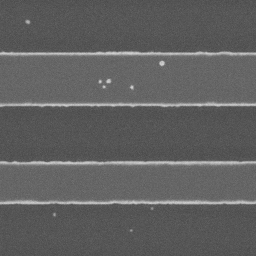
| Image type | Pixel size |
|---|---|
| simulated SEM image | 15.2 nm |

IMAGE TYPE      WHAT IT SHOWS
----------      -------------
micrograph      lines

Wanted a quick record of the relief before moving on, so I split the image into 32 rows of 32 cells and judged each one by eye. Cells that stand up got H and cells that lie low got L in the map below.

LLLLLLLLLLLLLLLLLLLLLLLLLLLLLLLL
LLLLLLLLLLLLLLLLLLLLLLLLLLLLLLLL
LLLLLLLLLLLLLLLLLLLLLLLLLLLLLLLL
LLLLLLLLLLLLLLLLLLLLLLLLLLLLLLLL
LLLLLLLLLLLLLLLLLLLLLLLLLLLLLLLL
LLLLLLLLLLLLLLLLLLLLLLLLLLLLLLLL
LLLLLLLLLLLLLLLLLLLLLLLLLLLLLLLL
HHHHHHHHHHHHHHHHHHHHHHHHHHHHHHHH
HHHHHHHHHHHHHHHHHHHHHHHHHHHHHHHH
HHHHHHHHHHHHHHHHHHHHHHHHHHHHHHHH
HHHHHHHHHHHHHHHHHHHHHHHHHHHHHHHH
HHHHHHHHHHHHHHHHHHHHHHHHHHHHHHHH
HHHHHHHHHHHHHHHHHHHHHHHHHHHHHHHH
LLLLLLLLLLLLLLLLLLLLLLLLLLLLLLLL
LLLLLLLLLLLLLLLLLLLLLLLLLLLLLLLL
LLLLLLLLLLLLLLLLLLLLLLLLLLLLLLLL
LLLLLLLLLLLLLLLLLLLLLLLLLLLLLLLL
LLLLLLLLLLLLLLLLLLLLLLLLLLLLLLLL
LLLLLLLLLLLLLLLLLLLLLLLLLLLLLLLL
LLLLLLLLLLLLLLLLLLLLLLLLLLLLLLLL
HHHHHHHHHHHHHHHHHHHHHHHHHHHHHHHH
HHHHHHHHHHHHHHHHHHHHHHHHHHHHHHHH
HHHHHHHHHHHHHHHHHHHHHHHHHHHHHHHH
HHHHHHHHHHHHHHHHHHHHHHHHHHHHHHHH
HHHHHHHHHHHHHHHHHHHHHHHHHHHHHHHH
LLLLLLLLLLLLLLLLLLLLLLLLLLLLLLLL
LLLLLLLLLLLLLLLLLLLLLLLLLLLLLLLL
LLLLLLLLLLLLLLLLLLLLLLLLLLLLLLLL
LLLLLLLLLLLLLLLLLLLLLLLLLLLLLLLL
LLLLLLLLLLLLLLLLLLLLLLLLLLLLLLLL
LLLLLLLLLLLLLLLLLLLLLLLLLLLLLLLL
LLLLLLLLLLLLLLLLLLLLLLLLLLLLLLLL